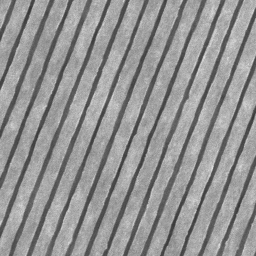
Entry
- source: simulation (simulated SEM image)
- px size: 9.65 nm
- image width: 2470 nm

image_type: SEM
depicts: parallel lines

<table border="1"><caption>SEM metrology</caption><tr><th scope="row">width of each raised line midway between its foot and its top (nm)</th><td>133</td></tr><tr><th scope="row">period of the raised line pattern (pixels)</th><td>17.7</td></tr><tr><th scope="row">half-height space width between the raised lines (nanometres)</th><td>41.6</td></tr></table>